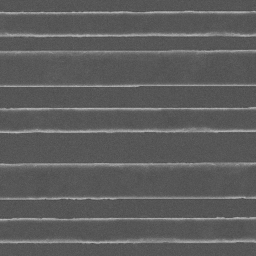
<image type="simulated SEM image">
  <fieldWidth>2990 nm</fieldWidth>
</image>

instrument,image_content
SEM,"lines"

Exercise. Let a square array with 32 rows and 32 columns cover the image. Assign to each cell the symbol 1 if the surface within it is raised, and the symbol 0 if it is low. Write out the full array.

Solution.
00000000000000000000000000000000
00000000000000000000000000000000
11111111111111111111111111111111
11111111111111111111111111111111
00000000000000000000000000000000
00000000000000000000000000000000
00000000000000000000001111111111
11111111111111111111111111111111
11111111111111111111111111111111
11111111111111111111111111111111
11111111111111111111111111111111
00000000000000000000000000000000
00000000000000000000000000000000
00000000000000000000000000000001
11111111111111111111111111111111
11111111111111111111111111111111
11100000100000000000000000000000
00000000000000000000000000000000
00000000000000000000000000000000
00000000000000000000000000000000
00000000000111000000111111100111
11111111111111111111111111111111
11111111111111111111111111111111
11111111111111111111111111111111
11111111111111111111111111111111
00000000000000000000000000000000
00000000000000000000000000000000
11111111111111111111111111111111
11111111111111111111111111111111
11111111111111111111111111111111
00000000000000000000000000000000
00000000000000000000000000000000